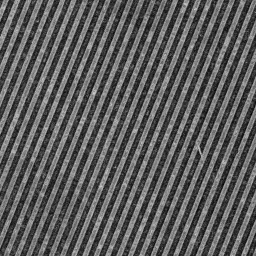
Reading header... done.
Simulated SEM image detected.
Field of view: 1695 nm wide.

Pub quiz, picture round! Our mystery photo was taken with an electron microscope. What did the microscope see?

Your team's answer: parallel lines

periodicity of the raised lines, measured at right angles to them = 0.0696 um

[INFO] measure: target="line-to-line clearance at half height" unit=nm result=40.8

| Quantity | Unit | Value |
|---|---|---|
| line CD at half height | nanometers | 25.4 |